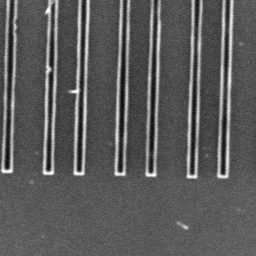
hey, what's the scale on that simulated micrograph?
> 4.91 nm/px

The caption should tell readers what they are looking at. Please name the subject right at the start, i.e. parallel lines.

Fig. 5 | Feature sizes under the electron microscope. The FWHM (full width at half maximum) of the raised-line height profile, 43.5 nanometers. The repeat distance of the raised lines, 0.176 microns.